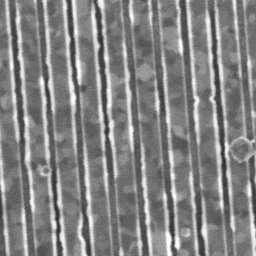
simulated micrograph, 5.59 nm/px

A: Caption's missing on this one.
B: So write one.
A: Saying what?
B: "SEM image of parallel lines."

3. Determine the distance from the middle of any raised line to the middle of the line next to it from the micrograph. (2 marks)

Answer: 158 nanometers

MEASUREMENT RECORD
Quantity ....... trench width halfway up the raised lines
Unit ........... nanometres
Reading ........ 37.6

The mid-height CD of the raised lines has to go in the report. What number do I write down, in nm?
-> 123